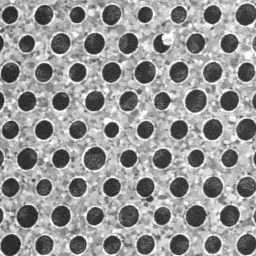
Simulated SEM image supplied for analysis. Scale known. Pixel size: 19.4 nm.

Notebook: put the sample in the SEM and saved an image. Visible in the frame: a regular array of holes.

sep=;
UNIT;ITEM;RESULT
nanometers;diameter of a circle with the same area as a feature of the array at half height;387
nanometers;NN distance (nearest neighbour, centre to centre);643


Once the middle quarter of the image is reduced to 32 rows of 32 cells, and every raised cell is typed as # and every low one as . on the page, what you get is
##...#####....####.....####....#
#.....###.....###......###.....#
#.....###.....###......###.....#
#....#####....####.....###.....#
##..#######..######...#####...##
################################
#######..#######.###############
.#####....####....#####...#####.
..###.....####.....###.....###..
..###.....####.....###.....###..
.####.....####....#####...####..
######...######...######.######.
################################
################################
##...######..######...#####...##
#.....####....####....#####....#
#.....####....####.....###.....#
#....#####....####....####.....#
##...######.#######..######...##
################################
#######.########################
######....#####...#####...######
.####.....####....####.....####.
..###......###.....###.....####.
.####.....####....####.....####.
.####.....#####..######...######
######...#######################
################################
###..######..######...######..##
##....####....####.....####....#
#.....####....####.....###.....#
#.....####....####.....###.....#